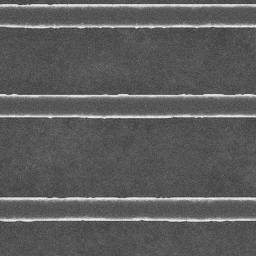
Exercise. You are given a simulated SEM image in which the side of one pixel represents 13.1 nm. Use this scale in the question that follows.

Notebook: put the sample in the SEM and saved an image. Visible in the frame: lines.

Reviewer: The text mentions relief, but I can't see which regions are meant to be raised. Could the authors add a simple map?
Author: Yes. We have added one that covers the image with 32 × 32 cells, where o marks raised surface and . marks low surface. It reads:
................................
oooooooooooooooooooooooooooooooo
oooooooooooooooooooooooooooooooo
................................
................................
................................
................................
................................
................................
................................
................................
................................
oooooooooooooooooooooooooooooooo
oooooooooooooooooooooooooooooooo
oooooooooooooooooooooooooooooooo
................................
................................
................................
................................
................................
................................
................................
................................
................................
................................
oooooooooooooooooooooooooooooooo
oooooooooooooooooooooooooooooooo
oooooooooo.oooooo.oooooooooooooo
................................
................................
................................
................................